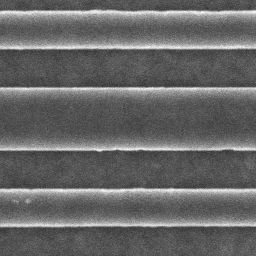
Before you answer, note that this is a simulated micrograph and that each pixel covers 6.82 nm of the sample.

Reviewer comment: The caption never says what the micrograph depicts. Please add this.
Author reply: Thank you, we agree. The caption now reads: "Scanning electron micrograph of lines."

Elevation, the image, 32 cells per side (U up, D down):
DDDDDDDDDDDDDDDDDDDDDDDDDDDDDDDD
UUUUUUUUUUUUUUUDDDUUUUUUUUDDUUUU
UUUUUUUUUUUUUUUUUUUUUUUUUUUUUUUU
UUUUUUUUUUUUUUUUUUUUUUUUUUUUUUUU
UUUUUUUUUUUUUUUUUUUUUUUUUUUUUUUU
UUUUUUUUUUUUUUUUUUUUUUUUUUUUUUUU
DDDDDDDDDDDDDDDDDDDDDDDDDDDDDDDD
DDDDDDDDDDDDDDDDDDDDDDDDDDDDDDDD
DDDDDDDDDDDDDDDDDDDDDDDDDDDDDDDD
DDDDDDDDDDDDDDDDDDDDDDDDDDDDDDDD
DDDDDDDDDDDDDDDDDDDDDDDDDDDDDDDD
UUUUUUUUUUUUUUUUUUUUUUUUUUUUUUUU
UUUUUUUUUUUUUUUUUUUUUUUUUUUUUUUU
UUUUUUUUUUUUUUUUUUUUUUUUUUUUUUUU
UUUUUUUUUUUUUUUUUUUUUUUUUUUUUUUU
UUUUUUUUUUUUUUUUUUUUUUUUUUUUUUUU
UUUUUUUUUUUUUUUUUUUUUUUUUUUUUUUU
UUUUUUUUUUUUUUUUUUUUUUUUUUUUUUUU
UUUUUUUUUUUUUUUUUUUUUUUUUUUUUUUU
DDDDDDDDDDDDDDDDDDDDDDDDDDDDDDDD
DDDDDDDDDDDDDDDDDDDDDDDDDDDDDDDD
DDDDDDDDDDDDDDDDDDDDDDDDDDDDDDDD
DDDDDDDDDDDDDDDDDDDDDDDDDDDDDDDD
DDDDDDDDDDDDDDDDDDDDDDDDDDDDDDDD
UUUUUUUUUUUUUUUUUUUUUUUUUUUUUUUU
UUUUUUUUUUUUUUUUUUUUUUUUUUUUUUUU
UUUUUUUUUUUUUUUUUUUUUUUUUUUUUUUU
UUUUUUUUUUUUUUUUUUUUUUUUUUUUUUUU
DDDDDDDDDDDDDDDDDDDDDDDDDDDDDDDD
DDDDDDDDDDDDDDDDDDDDDDDDDDDDDDDD
DDDDDDDDDDDDDDDDDDDDDDDDDDDDDDDD
DDDDDDDDDDDDDDDDDDDDDDDDDDDDDDDD